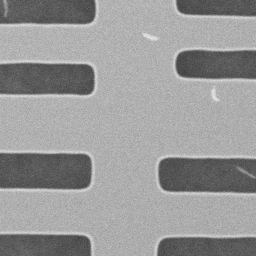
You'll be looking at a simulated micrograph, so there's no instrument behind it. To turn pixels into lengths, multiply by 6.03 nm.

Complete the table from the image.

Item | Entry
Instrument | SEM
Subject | groups of lines, slits or small figures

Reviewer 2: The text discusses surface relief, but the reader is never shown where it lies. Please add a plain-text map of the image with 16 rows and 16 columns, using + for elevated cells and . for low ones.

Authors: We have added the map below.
......+++++.....
.+...+++++++++++
++++++++++++++++
+++++++++++.....
......+++++.....
......++++++++++
++++++++++++++++
++++++++++++++++
++++++++++++++++
++++++++++++++++
......++++......
......++++......
++++++++++++++++
++++++++++++++++
++++++++++++++++
......++++......